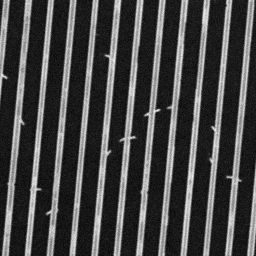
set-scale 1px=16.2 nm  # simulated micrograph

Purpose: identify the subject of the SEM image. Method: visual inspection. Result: parallel lines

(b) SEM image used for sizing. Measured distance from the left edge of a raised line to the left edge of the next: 22.2 px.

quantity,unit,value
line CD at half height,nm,76.6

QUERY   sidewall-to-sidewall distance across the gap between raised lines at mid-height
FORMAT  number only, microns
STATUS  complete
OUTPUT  0.284